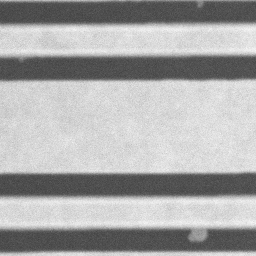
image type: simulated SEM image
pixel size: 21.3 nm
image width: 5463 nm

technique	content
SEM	lines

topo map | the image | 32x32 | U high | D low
DDDDDDDDDDDDDDDDDDDDDDDDDDDDDDDD
DDDDDDDDDDDDDDDDDDDDDDDDDDDDDDDD
DDDDDDDDDDDDDDDDDDDDDDDDDDDDDDDD
UUUUUUUUUUUUUUUUUUUUUUUUUUUUUUUU
UUUUUUUUUUUUUUUUUUUUUUUUUUUUUUUU
UUUUUUUUUUUUUUUUUUUUUUUUUUUUUUUU
UUUUUUUUUUUUUUUUUUUUUUUUUUUUUUUU
DDDDDDDDDDDDDDDDDDDDDDDDDDDDDDDD
DDDDDDDDDDDDDDDDDDDDDDDDDDDDDDDD
DDDDDDDDDDDDDDDDDDDDDDDDDDDDDDDD
UUUUUUUUUUUUUUUUUUUUUUUUUUUUUUUU
UUUUUUUUUUUUUUUUUUUUUUUUUUUUUUUU
UUUUUUUUUUUUUUUUUUUUUUUUUUUUUUUU
UUUUUUUUUUUUUUUUUUUUUUUUUUUUUUUU
UUUUUUUUUUUUUUUUUUUUUUUUUUUUUUUU
UUUUUUUUUUUUUUUUUUUUUUUUUUUUUUUU
UUUUUUUUUUUUUUUUUUUUUUUUUUUUUUUU
UUUUUUUUUUUUUUUUUUUUUUUUUUUUUUUU
UUUUUUUUUUUUUUUUUUUUUUUUUUUUUUUU
UUUUUUUUUUUUUUUUUUUUUUUUUUUUUUUU
UUUUUUUUUUUUUUUUUUUUUUUUUUUUUUUU
UUUUUUUUUUUUUUUUUUUUUUUUUUUUUUDD
DDDDDDDDDDDDDDDDDDDDDDDDDDDDDDDD
DDDDDDDDDDDDDDDDDDDDDDDDDDDDDDDD
DDDDDDDDDDDDDDDDDDDDDDDDDDDDDDDD
UUUUUUUUUUUUUUUUUUUUUUUUUUUUUUUU
UUUUUUUUUUUUUUUUUUUUUUUUUUUUUUUU
UUUUUUUUUUUUUUUUUUUUUUUUUUUUUUUU
DDDDDDDDDDDDDDDDDDDDDDDDDDDDDDDD
DDDDDDDDDDDDDDDDDDDDDDDDDDDDDDDD
DDDDDDDDDDDDDDDDDDDDDDDDDDDDDDDD
DDDDDDDDDDDDDDDDDDDDDDDDDDDDDDDD